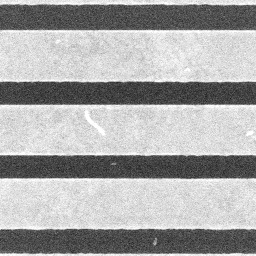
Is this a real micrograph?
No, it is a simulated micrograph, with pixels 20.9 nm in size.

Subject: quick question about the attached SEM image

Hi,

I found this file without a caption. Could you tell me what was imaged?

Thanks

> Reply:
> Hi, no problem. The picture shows lines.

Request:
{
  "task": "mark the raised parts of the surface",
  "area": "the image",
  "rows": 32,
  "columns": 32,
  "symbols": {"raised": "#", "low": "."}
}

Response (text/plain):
...##.##.##..#.####.#####.######
................................
................................
................................
################################
################################
################################
################################
################################
################################
................................
................................
................................
################################
################################
################################
################################
################################
################################
................................
................................
................................
################################
################################
################################
################################
################################
################################
################################
................................
................................
................................